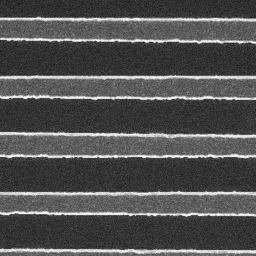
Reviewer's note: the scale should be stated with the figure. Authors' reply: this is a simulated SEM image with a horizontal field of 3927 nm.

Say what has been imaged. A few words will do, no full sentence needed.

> lines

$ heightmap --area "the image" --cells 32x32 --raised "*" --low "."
................................
................................
******************.*..*...**....
********************************
********************************
................................
................................
................................
................................
................................
********************************
********************************
................................
................................
................................
................................
................................
********************************
********************************
********************************
................................
................................
................................
................................
********************************
********************************
********************************
................................
................................
................................
................................
********************************